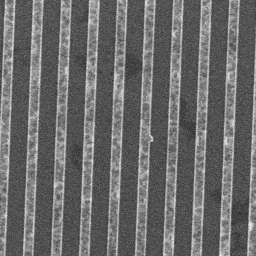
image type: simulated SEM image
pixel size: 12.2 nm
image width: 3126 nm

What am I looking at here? parallel lines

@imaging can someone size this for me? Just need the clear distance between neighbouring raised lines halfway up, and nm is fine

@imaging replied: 229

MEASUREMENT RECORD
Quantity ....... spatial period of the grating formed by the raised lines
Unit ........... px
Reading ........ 28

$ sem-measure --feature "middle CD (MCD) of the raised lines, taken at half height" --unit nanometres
110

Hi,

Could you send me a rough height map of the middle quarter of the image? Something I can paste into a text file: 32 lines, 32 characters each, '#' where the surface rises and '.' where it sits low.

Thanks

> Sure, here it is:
#.....##.....##.....##.....##...
#.....##.....##.....##.....##...
#.....##.....##.....##.....##...
#.....##.....##.....##.....##...
#.....##.....##.....##.....##...
#.....##.....##.....##.....##...
#.....##.....##.....##.....##...
#.....##....###.....##.....##...
#.....##....###.....#......##...
#....###....###....##.....###...
#....###.....##....###....###...
#....###....###....##......##...
......##....##.....##.....###...
.....###....##.....##.....##....
.....##.....##......#.....##....
.....##.....##......#.....##....
.....##.....##.....##.....##....
.....##.....##.....##.....##....
.....##.....##.....###....##....
.....##.....##.....###....##....
.....##.....##.....##.....##....
.....##.....##.....##.....##....
.....##.....##.....##.....##....
.....##.....##.....##.....##....
.....##.....##.....##.....##....
.....##.....##.....##.....##....
.....##.....##.....##.....##....
.....##.....##.....##.....##....
.....##.....##.....##.....##....
.....##.....##.....##.....##....
.....##.....##.....##.....##....
.....##.....##.....##.....##....